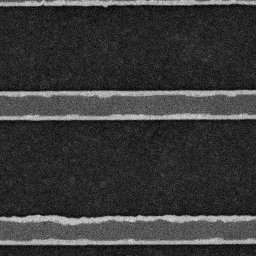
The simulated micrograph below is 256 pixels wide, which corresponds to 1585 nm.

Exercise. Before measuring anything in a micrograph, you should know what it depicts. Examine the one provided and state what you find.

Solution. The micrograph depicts one or a few lines or trenches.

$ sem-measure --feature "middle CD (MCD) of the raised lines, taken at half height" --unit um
0.156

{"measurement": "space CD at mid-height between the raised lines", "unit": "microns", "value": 0.581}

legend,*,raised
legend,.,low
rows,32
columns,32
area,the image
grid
*****................***........
................................
................................
................................
................................
................................
................................
................................
................................
................................
................................
................................
********************************
********************************
********************************
................................
................................
................................
................................
................................
................................
................................
................................
................................
................................
................................
................................
*********.**********************
********************************
********************************
................................
................................